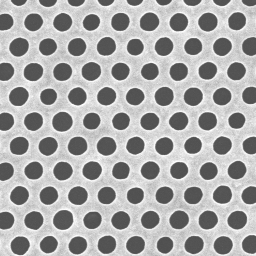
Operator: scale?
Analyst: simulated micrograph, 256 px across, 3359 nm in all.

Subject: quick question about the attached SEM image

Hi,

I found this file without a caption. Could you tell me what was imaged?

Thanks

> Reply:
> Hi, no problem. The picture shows a regular array of holes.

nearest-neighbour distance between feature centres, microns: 0.372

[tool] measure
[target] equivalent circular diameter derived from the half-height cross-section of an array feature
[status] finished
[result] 244 nanometers